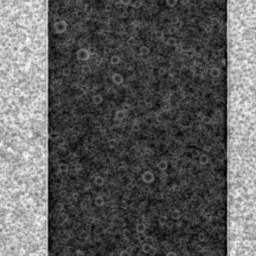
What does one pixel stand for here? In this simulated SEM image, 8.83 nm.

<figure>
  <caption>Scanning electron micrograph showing one or a few lines or trenches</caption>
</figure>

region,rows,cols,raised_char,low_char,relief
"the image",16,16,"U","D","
UUUDDDDDDDDDDDUU
UUUDDDDDDDDDDDUU
UUUDDDDDDDDDDDUU
UUUDDDDDDDDDDDUU
UUUDDDDDDDDDDDUU
UUUDDDDDDDDDDDUU
UUUDDDDDDDDDDDUU
UUUDDDDDDDDDDDUU
UUUDDDDDDDDDDDUU
UUUDDDDDDDDDDDUU
UUUDDDDDDDDDDDUU
UUUDDDDDDDDDDDUU
UUUDDDDDDDDDDDUU
UUUDDDDDDDDDDDUU
UUUDDDDDDDDDDDUU
UUUDDDDDDDDDDDUU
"